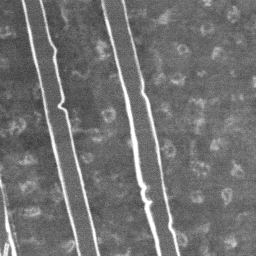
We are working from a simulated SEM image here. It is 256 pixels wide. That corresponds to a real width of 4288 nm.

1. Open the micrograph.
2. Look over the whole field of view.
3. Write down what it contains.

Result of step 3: one or a few lines or trenches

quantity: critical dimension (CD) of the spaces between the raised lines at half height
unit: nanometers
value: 1000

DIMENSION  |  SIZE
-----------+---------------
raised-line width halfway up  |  329 nanometres